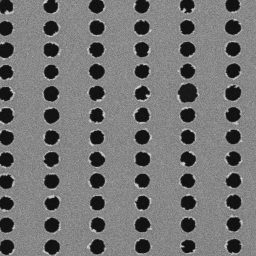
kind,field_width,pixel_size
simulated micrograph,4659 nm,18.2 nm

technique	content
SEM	a regular array of holes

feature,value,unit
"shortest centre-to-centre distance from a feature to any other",396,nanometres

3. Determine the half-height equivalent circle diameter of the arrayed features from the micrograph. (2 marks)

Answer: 272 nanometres